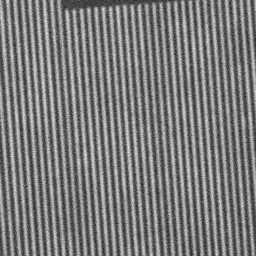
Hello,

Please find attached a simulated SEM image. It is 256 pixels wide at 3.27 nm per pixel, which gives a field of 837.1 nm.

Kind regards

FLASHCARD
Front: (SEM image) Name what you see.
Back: parallel lines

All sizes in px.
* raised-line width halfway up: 1.62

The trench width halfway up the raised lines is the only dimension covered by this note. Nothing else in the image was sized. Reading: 18.3 nanometers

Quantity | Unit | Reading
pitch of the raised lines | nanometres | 23.8